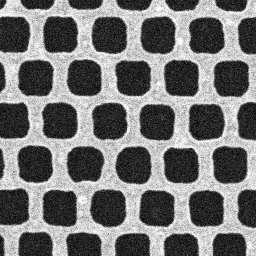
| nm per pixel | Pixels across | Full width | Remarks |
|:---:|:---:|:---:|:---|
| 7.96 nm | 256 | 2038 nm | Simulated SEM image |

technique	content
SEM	a regular array of holes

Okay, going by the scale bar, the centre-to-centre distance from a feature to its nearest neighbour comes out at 0.385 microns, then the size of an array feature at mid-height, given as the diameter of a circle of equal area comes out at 309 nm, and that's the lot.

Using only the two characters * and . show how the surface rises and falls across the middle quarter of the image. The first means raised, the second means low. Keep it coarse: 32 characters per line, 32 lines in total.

*........****.........***.......
*........****.........***.......
*........****.........***.......
*........****.........***.......
..........***.........***.......
*........****.........***.......
*........****........****.......
**......******......******......
********************************
***********.********************
..******.......*****......******
...****.........***........****.
...****.........***.........***.
...****.........***.........***.
...****.........***.........***.
...****.........***.........***.
...****.........***.........***.
...****........****........*****
..******......******.......*****
********************************
***...**************************
**.......*****.......*****......
*.........****........***.......
*.........***.........***.......
*.........***.........***.......
*.........***.........***.......
*.........***.........***.......
*.........***.........***.......
**.......*****.......*****......
**..***.*******......*****......
********************************
********....*********.**********